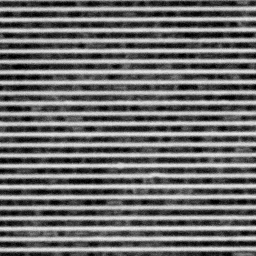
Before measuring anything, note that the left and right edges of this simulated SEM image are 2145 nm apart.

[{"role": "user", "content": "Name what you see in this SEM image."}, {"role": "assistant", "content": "parallel lines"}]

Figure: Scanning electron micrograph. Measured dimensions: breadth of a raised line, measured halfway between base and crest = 28.3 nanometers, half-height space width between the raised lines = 0.0576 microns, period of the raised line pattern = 87.6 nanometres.